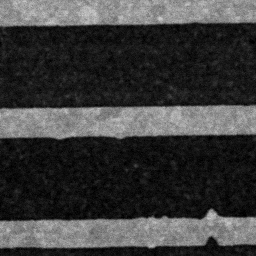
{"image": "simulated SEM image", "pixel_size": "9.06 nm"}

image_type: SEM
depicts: one or a few lines or trenches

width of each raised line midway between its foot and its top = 27.9 px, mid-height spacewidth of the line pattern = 0.752 um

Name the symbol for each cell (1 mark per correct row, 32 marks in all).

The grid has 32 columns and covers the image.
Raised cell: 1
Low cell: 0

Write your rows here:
11111111111111111111111111111111
11111111111111111111111111111111
11111111111111111111111111111111
00000000000000000000000000000000
00000000000000000000000000000000
00000000000000000000000000000000
00000000000000000000000000000000
00000000000000000000000000000000
00000000000000000000000000000000
00000000000000000000000000000000
00000000000000000000000000000000
00000000000000000000000000000000
00000000000000000000000000000000
00000000000011111111111111111111
11111111111111111111111111111111
11111111111111111111111111111111
11111111111111111111111111111111
00000000000000000000000000000000
00000000000000000000000000000000
00000000000000000000000000000000
00000000000000000000000000000000
00000000000000000000000000000000
00000000000000000000000000000000
00000000000000000000000000000000
00000000000000000000000000000000
00000000000000000000000000000000
00000000000000000000000000100000
00000000000110001111111111111111
11111111111111111111111111111111
11111111111111111111111111111111
11111111111111111111111110001101
00000000000000000000000000000000